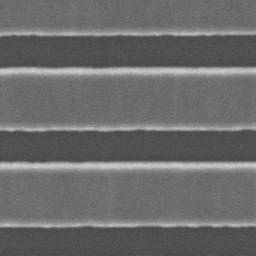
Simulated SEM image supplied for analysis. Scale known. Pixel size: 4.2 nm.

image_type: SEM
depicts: lines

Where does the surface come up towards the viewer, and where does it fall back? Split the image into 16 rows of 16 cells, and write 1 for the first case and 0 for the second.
1111111111111111
1111111111111111
0000000000000000
0000000000000000
1111111111111111
1111111111111111
1111111111111111
1111111111111111
0000000000000000
0000000000000000
1111111111111111
1111111111111111
1111111111111111
1111111111111111
0000000000000000
0000000000000000